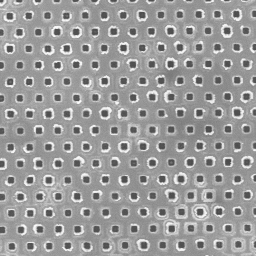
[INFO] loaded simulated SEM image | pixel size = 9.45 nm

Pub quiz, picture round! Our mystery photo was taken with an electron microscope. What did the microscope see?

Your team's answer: a regular array of holes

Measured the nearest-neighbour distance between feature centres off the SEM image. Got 175 nm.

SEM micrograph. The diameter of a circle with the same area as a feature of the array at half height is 0.0708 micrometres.